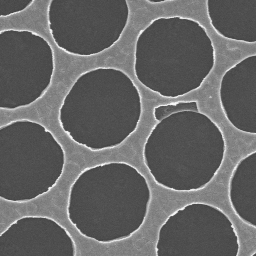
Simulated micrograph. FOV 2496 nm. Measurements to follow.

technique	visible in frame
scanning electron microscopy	holes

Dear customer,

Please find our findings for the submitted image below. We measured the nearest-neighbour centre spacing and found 878 nm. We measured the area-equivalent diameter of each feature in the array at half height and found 772 nanometers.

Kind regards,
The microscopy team